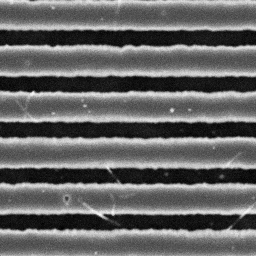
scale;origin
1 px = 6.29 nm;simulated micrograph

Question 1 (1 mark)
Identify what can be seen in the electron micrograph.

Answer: lines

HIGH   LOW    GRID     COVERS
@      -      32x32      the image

@@@@@@@@@@@@@@@@@@@@@@@@@@@@@@@@
@@@@@@@@@@@@@@@@@@@@@@@@@@@@@@@@
@@@@@@@@@@@@@@@@@@@@@@@@@@@@@@@@
@@@@@@@@@@@@@@@@@@@@@@@@@@@@@@@@
--------------------------------
--------------------------------
@@@@@@@@@@@@@@@@@@@@@@@@@@@@@@@@
@@@@@@@@@@@@@@@@@@@@@@@@@@@@@@@@
@@@@@@@@@@@@@@@@@@@@@@@@@@@@@@@@
-@-----@@---------@@-----------@
--------------------------------
@-@-------------@------@--------
@@@@@@@@@@@@@@@@@@@@@@@@@@@@@@@@
@@@@@@@@@@@@@@@@@@@@@@@@@@@@@@@@
@@@@@@@@@@@@@@@@@@@@@@@@@@@@@@@@
--------------------------------
--------------------------------
@@@@@@@@@@@@@@@@@@@@@@@@@@@@@@@@
@@@@@@@@@@@@@@@@@@@@@@@@@@@@@@@@
@@@@@@@@@@@@@@@@@@@@@@@@@@@@@@@@
@@@@@@@@@@@@@@@@@@@@@@@@@@@@@@@@
--------------------------------
--------------------------------
@@@@@@@@@@@@@@@@@@@@@@@@@@@@@@@@
@@@@@@@@@@@@@@@@@@@@@@@@@@@@@@@@
@@@@@@@@@@@@@@@@@@@@@@@@@@@@@@@@
@@@@@@@@@@@@@@@@@@@@@@@@@@@@@@@@
--------------------------------
--------------------------------
@@@@@@@@@@@@@@@@@@@@@@@@@@@@@@@@
@@@@@@@@@@@@@@@@@@@@@@@@@@@@@@@@
@@@@@@@@@@@@@@@@@@@@@@@@@@@@@@@@